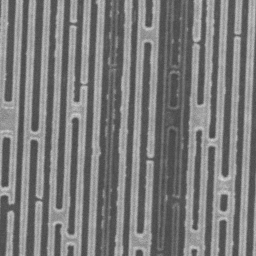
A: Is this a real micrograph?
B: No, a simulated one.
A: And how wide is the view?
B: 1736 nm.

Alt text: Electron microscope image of parallel lines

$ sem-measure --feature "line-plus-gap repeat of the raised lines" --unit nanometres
92.9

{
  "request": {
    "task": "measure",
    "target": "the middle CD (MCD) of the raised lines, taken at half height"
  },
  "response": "32.2 nanometers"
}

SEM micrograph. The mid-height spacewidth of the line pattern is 56.7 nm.